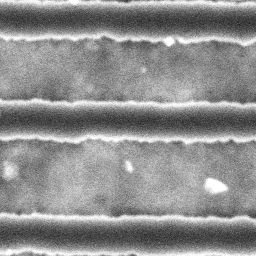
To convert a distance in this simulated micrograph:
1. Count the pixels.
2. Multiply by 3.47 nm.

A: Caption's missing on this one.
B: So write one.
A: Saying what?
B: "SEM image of lines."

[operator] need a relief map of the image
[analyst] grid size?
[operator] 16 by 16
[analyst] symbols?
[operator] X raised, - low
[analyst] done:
XXXXXXXXXXXXXXXX
XXXXXXXXXXXXXXXX
---------XXXX-XX
----------------
----------------
----------------
XXXXXXXXXX-XXXX-
XXXXXXXXXXXXXXXX
XXXXXXXXXXXXXXXX
----------------
----------------
----------------
----------------
XXX-------------
XXXXXXXXXXXXXXXX
XXXXXXXXXXXXXXXX